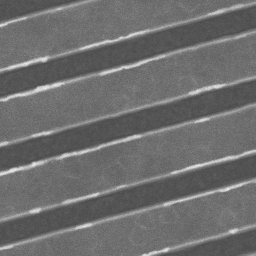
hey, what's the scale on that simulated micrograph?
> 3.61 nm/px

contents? one or a few lines or trenches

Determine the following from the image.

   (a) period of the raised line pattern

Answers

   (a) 259 nm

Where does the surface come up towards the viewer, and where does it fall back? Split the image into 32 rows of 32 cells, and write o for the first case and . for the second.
.........ooooooooooooooooooooooo
.....ooooooooooooooooooooooo....
.oooooooooooooooooooooooo.......
ooooooooooooooooooooo...........
ooooooooooooooooo............ooo
oooooooooooooo...........ooooooo
ooooooooo............ooooooooooo
oooooo............oooooooooooooo
oo.............ooooooooooooooooo
..........oooooooooooooooooooooo
.......ooooooooooooooooooooooo..
...oooooooooooooooooooooo.......
oooooooooooooooooooooo..........
oooooooooooooooooo............oo
ooooooooooooooo...........oooooo
oooooooooo............oooooooooo
ooooooo............ooooooooooooo
ooo............ooooooooooooooooo
...........ooooooooooooooooooooo
.......oooooooooooooooooooooooo.
....ooooooooooooooooooooooo.....
ooooooooooooooooooooooo.........
ooooooooooooooooooo............o
oooooooooooooooo............oooo
oooooooooooo............oooooooo
oooooooo............oooooooooooo
ooooo...........oooooooooooooooo
o............ooooooooooooooooooo
.........ooooooooooooooooooooooo
.....ooooooooooooooooooooooo....
.ooooooooooooooooooooooo........
ooooooooooooooooooooo...........